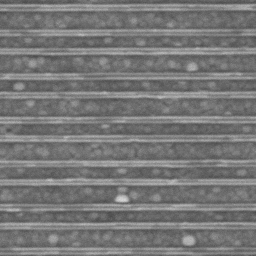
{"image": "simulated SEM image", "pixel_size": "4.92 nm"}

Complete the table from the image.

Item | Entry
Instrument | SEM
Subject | parallel lines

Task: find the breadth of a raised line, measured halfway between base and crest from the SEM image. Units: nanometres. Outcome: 25.8